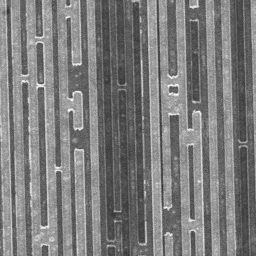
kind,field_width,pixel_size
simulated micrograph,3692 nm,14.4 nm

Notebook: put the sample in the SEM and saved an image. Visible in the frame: parallel lines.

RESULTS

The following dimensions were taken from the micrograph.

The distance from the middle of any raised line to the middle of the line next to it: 215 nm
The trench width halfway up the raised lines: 97.3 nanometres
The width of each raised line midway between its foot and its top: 112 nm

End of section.